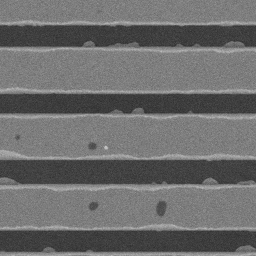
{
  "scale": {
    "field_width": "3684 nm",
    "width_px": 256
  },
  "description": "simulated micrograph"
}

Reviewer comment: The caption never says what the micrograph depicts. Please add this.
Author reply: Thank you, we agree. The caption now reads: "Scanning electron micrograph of lines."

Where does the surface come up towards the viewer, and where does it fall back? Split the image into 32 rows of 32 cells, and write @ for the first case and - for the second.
@@@@@@@@@@@@@@@@@@@@@@@@@@@@@@@@
@@@@@@@@@@@@@@@@@@@@@@@@@@@@@@@@
@@@@@@@@@@@@@@@@@@@@@@@@@@@@@@@@
--------------------------------
--------------------------------
--------------------------------
@@@@@@@@@@@@@@@@@@@@@@@@@@@@@@@@
@@@@@@@@@@@@@@@@@@@@@@@@@@@@@@@@
@@@@@@@@@@@@@@@@@@@@@@@@@@@@@@@@
@@@@@@@@@@@@@@@@@@@@@@@@@@@@@@@@
@@@@@@@@@@@@@@@@@@@@@@@@@@@@@@@@
@--@@@@@@@@@@@@@@@@@@@@@@@@@@@@@
--------------------------------
--------------------------------
@@@@@@@@@@@@@@@@@@@@@@@@@@@@@-@@
@@@@@@@@@@@@@@@@@@@@@@@@@@@@@@@@
@@@@@@@@@@@@@@@@@@@@@@@@@@@@@@@@
@@@@@@@@@@@@@@@@@@@@@@@@@@@@@@@@
@@@@@@@@@@@@@@@@@@@@@@@@@@@@@@@@
@@@@@@@@@@@@@@@@@@@@@@@@@@@@@@@@
--------------------------------
--------------------------------
--------------------------------
@@@@@@@@@@@@@@@@@@@@@@@@@@@@@@@@
@@@@@@@@@@@@@@@@@@@@@@@@@@@@@@@@
@@@@@@@@@@@@@@@@@@@@@@@@@@@@@@@@
@@@@@@@@@@@@@@@@@@@@@@@@@@@@@@@@
@@@@@@@@@@@@@@@@@@@@@@@@@@@@@@@@
@@@@@@@@@@@@@@@@@@@@@@@@@@@@@@@@
--------------------------------
--------------------------------
--------------------------------